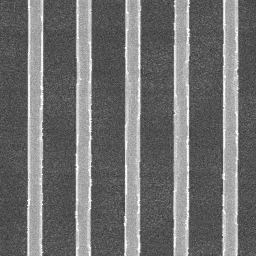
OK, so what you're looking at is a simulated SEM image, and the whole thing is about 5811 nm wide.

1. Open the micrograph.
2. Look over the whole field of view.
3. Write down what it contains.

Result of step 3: lines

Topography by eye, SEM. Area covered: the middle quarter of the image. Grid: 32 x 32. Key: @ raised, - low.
----@@@---------@@@---------@@@-
----@@@---------@@@---------@@--
----@@@---------@@@---------@@--
----@@@---------@@@---------@@@-
----@@@---------@@@---------@@@-
----@@----------@@@---------@@@-
----@@----------@@@---------@@@-
----@@----------@@@---------@@@-
----@@----------@@@---------@@@-
----@@----------@@@---------@@@-
----@@----------@@@---------@@@-
----@@----------@@@---------@@@-
----@@@---------@@@---------@@@-
----@@@---------@@@---------@@@-
----@@@---------@@----------@@@-
----@@@---------@@----------@@@-
----@@@---------@@----------@@@-
----@@@---------@@----------@@@-
----@@@---------@@----------@@@-
----@@@---------@@----------@@@-
---@@@----------@@----------@@@-
---@@@---------@@@----------@@@-
---@@@---------@@@----------@@@-
---@@@---------@@@----------@@@-
---@@@---------@@@----------@@@-
---@@@---------@@@----------@@@-
----@@----------@@----------@@@-
---@@@@---------@@----------@@@-
---@@@@--------@@@----------@@@-
---@@@@--------@@@----------@@@-
---@@@@---------@@----------@@@-
---@@@----------@@----------@@@-